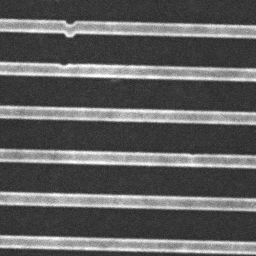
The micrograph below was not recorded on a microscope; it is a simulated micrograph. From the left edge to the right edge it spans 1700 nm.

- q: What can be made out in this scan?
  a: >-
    parallel lines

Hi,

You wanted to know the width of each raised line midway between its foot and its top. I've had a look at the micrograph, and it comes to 76.3 nm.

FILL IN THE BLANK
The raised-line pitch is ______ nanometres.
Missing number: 287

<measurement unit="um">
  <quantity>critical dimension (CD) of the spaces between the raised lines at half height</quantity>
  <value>0.213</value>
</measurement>